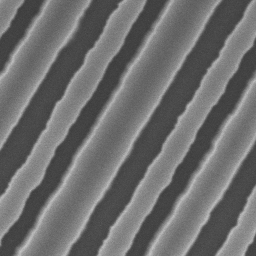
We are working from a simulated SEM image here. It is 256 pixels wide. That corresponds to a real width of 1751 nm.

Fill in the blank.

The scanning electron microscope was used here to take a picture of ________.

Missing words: lines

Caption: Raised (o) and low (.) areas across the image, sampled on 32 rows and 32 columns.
ooo...ooooo....ooo...oooooo....o
oo...ooooo....oooo...ooooo.....o
o...oooooo....ooo...oooooo....oo
o...ooooo....ooo...oooooo.....oo
...oooooo....ooo...oooooo....ooo
...ooooo....ooo...oooooo....oooo
..ooooo....oooo...oooooo....ooo.
.oooooo....ooo...oooooo....ooo..
.ooooo....ooo...oooooo....oooo..
oooooo...oooo...oooooo....ooo...
ooooo....ooo...oooooo....ooo...o
oooo....oooo...ooooo.....ooo...o
oooo....ooo...oooooo....ooo...oo
ooo....ooo...oooooo....ooo....oo
oo.....ooo...oooooo....ooo...ooo
oo....ooo...oooooo....ooo...oooo
o.....oo....ooooo.....ooo...oooo
o....ooo...oooooo....ooo...ooooo
....ooo...oooooo....oooo...oooo.
....ooo...oooooo....ooo...ooooo.
...ooo...oooooo....ooo...ooooo..
..oooo...ooooo....oooo...oooo...
..ooo...oooooo....ooo...ooooo...
.ooo....ooooo....oooo...oooo....
ooo....oooooo....ooo...ooooo...o
ooo...oooooo....ooo...ooooo....o
ooo..oooooo....oooo...oooo....oo
oo...oooooo....ooo...ooooo....oo
o...oooooo....ooo...ooooo....ooo
....oooooo....ooo...ooooo....ooo
...oooooo....ooo...ooooo....ooo.
..oooooo....oooo...oooo....oooo.